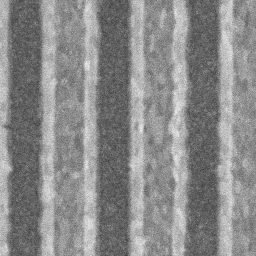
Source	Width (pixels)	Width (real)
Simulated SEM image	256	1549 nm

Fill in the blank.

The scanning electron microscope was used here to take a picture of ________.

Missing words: one or a few lines or trenches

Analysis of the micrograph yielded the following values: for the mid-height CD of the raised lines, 259 nanometres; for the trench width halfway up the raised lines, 279 nm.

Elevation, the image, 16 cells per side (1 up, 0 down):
0001110001100011
0001110001100011
0001110001100011
0001110001100011
0001110001100011
0001110001100011
0001110001100011
0001110001100011
0001110001100011
0001110001100011
0001110001100011
0001110001100011
0001110001100011
0001110001100011
0001110001100011
0001110001100011